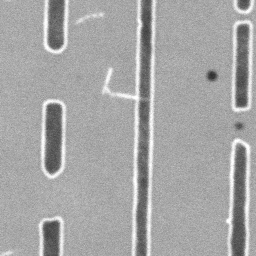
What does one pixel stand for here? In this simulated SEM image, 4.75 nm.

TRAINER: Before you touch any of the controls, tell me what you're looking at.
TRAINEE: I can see one or a few lines or trenches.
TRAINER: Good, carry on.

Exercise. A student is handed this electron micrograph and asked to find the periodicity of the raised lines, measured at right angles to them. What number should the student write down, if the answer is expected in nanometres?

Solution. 448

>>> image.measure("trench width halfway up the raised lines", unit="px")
79.7